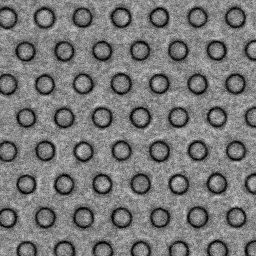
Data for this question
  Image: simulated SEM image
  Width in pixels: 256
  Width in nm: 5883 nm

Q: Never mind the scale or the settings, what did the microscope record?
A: a regular array of ring-shaped grooves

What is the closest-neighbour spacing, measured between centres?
889 nanometers